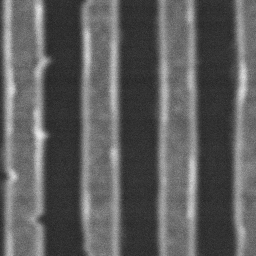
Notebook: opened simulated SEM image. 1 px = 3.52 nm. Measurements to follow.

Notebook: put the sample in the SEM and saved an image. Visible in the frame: one or a few lines or trenches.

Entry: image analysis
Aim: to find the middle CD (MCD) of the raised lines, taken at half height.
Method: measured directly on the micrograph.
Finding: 109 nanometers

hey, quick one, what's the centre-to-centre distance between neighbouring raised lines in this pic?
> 271 nm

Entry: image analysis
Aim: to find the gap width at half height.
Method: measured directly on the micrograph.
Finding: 45.5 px